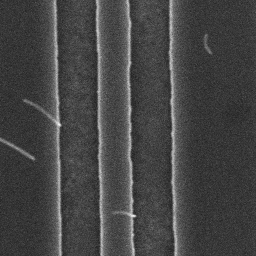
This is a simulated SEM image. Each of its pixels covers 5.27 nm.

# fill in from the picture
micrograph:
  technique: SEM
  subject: lines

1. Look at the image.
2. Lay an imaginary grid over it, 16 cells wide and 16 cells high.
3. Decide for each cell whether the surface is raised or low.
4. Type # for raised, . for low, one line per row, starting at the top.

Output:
###...##...#####
####..##...#####
####..##...#####
####..##...#####
####..##...#####
####..##...#####
####..##...#####
####..##...#####
####..##...#####
####..##...#####
####..##...#####
####..##...#####
####..##...#####
####..##...#####
####..##...#####
####..##...#####